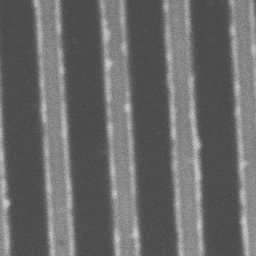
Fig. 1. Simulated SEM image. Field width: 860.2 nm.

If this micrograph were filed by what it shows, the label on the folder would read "one or a few lines or trenches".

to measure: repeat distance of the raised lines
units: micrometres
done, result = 0.217